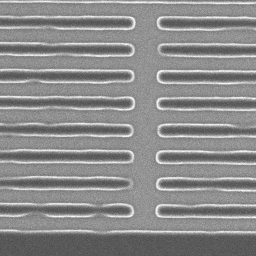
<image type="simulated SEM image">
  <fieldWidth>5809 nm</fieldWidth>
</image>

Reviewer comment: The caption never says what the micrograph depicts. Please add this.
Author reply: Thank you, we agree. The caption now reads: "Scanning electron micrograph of groups of lines, slits or small figures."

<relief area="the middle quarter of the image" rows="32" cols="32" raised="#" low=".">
................................
................................
#################......#########
#################......#########
###########.............########
................................
................................
................................
#################..........#####
##################.....#########
#################......#########
................................
................................
................................
................................
#################.......########
#################.......########
#################.......########
................................
................................
................................
................................
#################......#########
#################......#########
.....#######..##........########
................................
................................
................................
###....####.....................
#################......#########
#################......#########
................................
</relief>